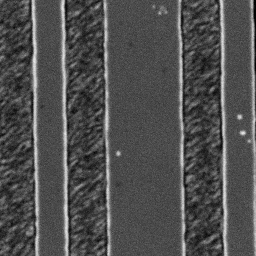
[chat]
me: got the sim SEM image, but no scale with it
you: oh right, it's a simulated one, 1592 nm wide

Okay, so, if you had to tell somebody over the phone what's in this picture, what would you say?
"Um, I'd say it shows lines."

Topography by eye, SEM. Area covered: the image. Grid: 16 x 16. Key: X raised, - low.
--XX---XXXX---XX
--XX---XXXX---XX
--XX---XXXX---XX
--XX---XXXX---XX
--XX---XXXX---XX
--XX---XXXX---XX
--XX---XXXX---XX
--XX---XXXX---XX
--XX---XXXX---XX
--XX---XXXX---XX
--XX---XXXX---XX
--XX---XXXX---XX
--XX---XXXX---XX
--XX---XXXXX--XX
--XX---XXXXX--XX
--XX---XXXXX--XX